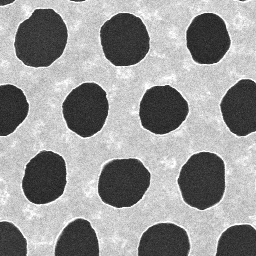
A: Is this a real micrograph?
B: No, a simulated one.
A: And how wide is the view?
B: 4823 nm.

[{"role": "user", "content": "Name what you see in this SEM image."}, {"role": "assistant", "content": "a regular array of holes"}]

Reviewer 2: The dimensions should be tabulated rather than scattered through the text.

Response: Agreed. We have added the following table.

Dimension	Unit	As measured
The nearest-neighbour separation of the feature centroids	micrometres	1.49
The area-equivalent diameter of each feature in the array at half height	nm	957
